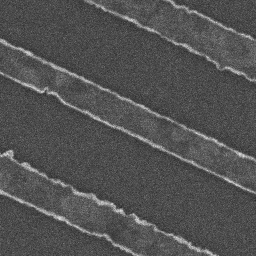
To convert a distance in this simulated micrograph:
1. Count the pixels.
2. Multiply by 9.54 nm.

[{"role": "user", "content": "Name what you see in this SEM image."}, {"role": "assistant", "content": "one or a few lines or trenches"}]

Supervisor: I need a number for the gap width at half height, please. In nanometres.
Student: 693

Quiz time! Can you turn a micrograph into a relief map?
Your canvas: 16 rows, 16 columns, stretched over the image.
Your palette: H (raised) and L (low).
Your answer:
LLLLLLHHHHHLLLLL
LLLLLLLLLHHHHHLL
LLLLLLLLLLLHHHHH
HHLLLLLLLLLLLHHH
HHHHLLLLLLLLLLLH
LLHHHHLLLLLLLLLL
LLLLHHHHHLLLLLLL
LLLLLLHHHHHLLLLL
LLLLLLLLHHHHHLLL
LLLLLLLLLLHHHHHL
HHLLLLLLLLLLLHHH
HHHHLLLLLLLLLLLH
LHHHHHLLLLLLLLLL
LLLHHHHHLLLLLLLL
LLLLLHHHHHLLLLLL
LLLLLLLLHHHHLLLL